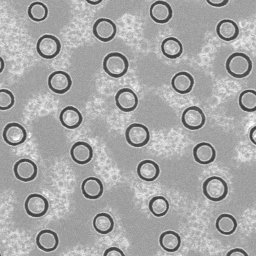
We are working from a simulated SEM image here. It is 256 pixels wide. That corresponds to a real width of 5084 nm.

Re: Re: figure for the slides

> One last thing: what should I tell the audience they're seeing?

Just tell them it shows a regular array of ring-shaped grooves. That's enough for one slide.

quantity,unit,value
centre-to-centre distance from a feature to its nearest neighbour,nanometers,745